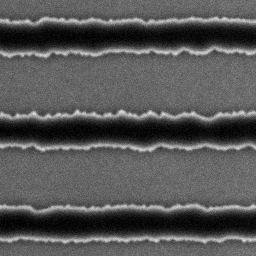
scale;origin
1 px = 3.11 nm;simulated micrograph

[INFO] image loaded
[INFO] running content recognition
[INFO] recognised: lines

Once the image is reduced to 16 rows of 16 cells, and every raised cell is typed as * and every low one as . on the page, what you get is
................
****************
****************
................
................
................
................
****************
****************
................
................
................
................
****************
****************
................